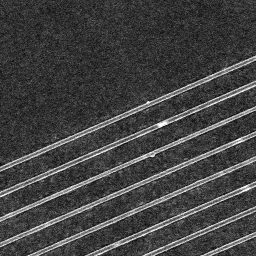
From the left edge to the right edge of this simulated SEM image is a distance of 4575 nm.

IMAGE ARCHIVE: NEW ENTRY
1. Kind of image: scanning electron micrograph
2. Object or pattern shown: parallel lines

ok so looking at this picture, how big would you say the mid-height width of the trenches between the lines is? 336 nanometres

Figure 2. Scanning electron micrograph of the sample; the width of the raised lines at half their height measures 73.7 nm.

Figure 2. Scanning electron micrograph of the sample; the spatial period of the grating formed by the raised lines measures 0.412 µm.